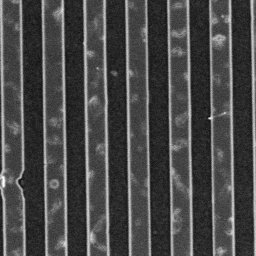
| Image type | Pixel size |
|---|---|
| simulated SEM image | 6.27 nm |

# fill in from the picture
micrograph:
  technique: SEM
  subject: parallel lines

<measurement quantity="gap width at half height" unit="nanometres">131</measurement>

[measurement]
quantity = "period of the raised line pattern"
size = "263 nm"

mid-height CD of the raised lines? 0.131 um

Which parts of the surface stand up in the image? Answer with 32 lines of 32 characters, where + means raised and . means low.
+++..+++...++...++...++...+++..+
+++..+++...++...++...++...+++..+
+++..+++...++...++...++...+++..+
+++..+++...++...++...+++..+++..+
+++..+++...++...++...+++..+++...
+++..+++...++...++...+++..+++...
+++..+++...++...++...+++..+++...
+++..+++...++...++...+++..+++...
+++..+++...++...++...+++..+++...
+++..+++...++...++...+++..+++...
+++...++...++...++...+++..+++...
+++..+++...++...+++..+++..+++...
+++..+++...++...+++..+++..+++...
+++..+++...++...++...+++..+++...
+++..+++...++...++...+++..+++...
+++..+++...++...++...+++..+++...
+++...++...++...++...+++..+++...
+++...++...++...++...+++..+++...
+++...++...++...+++..+++..+++...
+++...++...++...+++..+++..+++...
+++...++...++...+++..+++..+++...
+++...++...++...+++..+++...++...
++....++...++...+++..+++...++...
+++...++...++...+++..+++...++...
+++...++...++...+++..+++...++...
.++...++...++...+++..+++...++...
.++...++...++...+++..+++...++...
.++...++...+++..+++..+++...++...
.++...++...+++..+++..+++...++...
.++...++...+++..+++..+++...++...
.++...++...+++..+++..+++...++...
.++...++...+++..+++..+++...++...